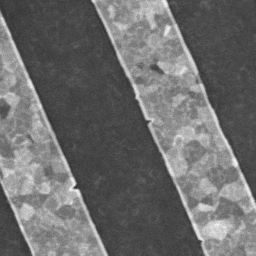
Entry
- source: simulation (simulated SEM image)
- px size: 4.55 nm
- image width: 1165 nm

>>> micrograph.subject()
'one or a few lines or trenches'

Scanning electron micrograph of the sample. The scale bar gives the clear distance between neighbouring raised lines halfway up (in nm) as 424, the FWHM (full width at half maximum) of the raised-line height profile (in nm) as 290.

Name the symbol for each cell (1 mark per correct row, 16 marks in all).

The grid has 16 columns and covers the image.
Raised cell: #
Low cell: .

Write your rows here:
......####......
.......####.....
#......####.....
#......#####....
##......####....
##......#####...
##.......####...
###......####...
###.......####..
####......####..
####.......####.
#####......####.
.####......#####
.#####......####
.#####......####
..####.......###